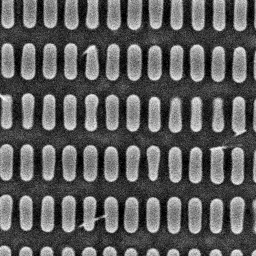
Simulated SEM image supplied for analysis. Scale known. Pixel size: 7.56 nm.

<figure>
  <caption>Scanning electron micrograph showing groups of lines, slits or small figures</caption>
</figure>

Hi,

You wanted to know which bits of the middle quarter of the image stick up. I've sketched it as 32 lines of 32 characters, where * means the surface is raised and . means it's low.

***...***..***..***..***...***..
***...***..***..***..***...***..
***...***..***..***..***...**...
.**...**...**...***...**...**...
................................
................................
................................
................................
***...**...**...***...*.........
***...**...**...***..***...**...
***...**...**...***..***...**...
***...**...**...***..***...**...
***...**...**...***..***...**...
***...**...**...***..***...**...
***..***...**...***..***..***...
***..***...**...***..***..***...
......*.........**....*....**...
................................
................................
................................
.*....*.........................
***..***...**...***..***...**...
***..***..***...***..***..***...
***..***..***...***..***..***...
***..***..***...***..***..***...
***..***..***...**...**...***...
***..***..***...**...**...***..*
***..***..***...**....*....**..*
***..***..***...**....*....**..*
...........................*....
................................
................................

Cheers